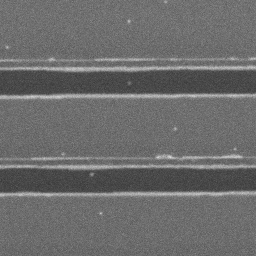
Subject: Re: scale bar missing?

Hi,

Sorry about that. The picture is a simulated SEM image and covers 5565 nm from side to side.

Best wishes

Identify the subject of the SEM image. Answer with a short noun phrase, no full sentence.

lines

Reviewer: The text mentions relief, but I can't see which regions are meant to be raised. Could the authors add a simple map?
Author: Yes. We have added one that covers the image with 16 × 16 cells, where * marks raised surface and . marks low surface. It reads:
****************
****************
****************
****************
................
................
****************
****************
****************
****************
................
................
****************
****************
****************
****************